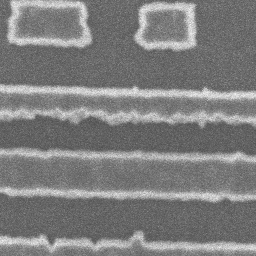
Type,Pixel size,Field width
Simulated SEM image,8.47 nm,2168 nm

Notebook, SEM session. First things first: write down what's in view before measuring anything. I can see one or a few lines or trenches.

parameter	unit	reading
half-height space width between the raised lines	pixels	45.5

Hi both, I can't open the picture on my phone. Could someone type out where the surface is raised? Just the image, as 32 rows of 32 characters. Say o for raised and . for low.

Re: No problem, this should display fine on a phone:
..oooooooo......................
..ooooooooo.......oooooo........
.oooooooooo.......oooooo........
.oooooooooo.......oooooo........
.oooooooooo......ooooooo........
.........oo.......oooooo........
................................
................................
................................
................................
................................
ooooooooooooooooo........o......
oooooooooooooooooooooooooooooooo
oooooooooooooooooooooooooooooooo
.o.o...ooo..oooooooooooooooooooo
................................
................................
................................
................................
oooooooooooooooooooooooooooo.oo.
oooooooooooooooooooooooooooooooo
oooooooooooooooooooooooooooooooo
oooooooooooooooooooooooooooooooo
oooooooooooooooooooooooooooooooo
.............ooo.o.ooooooooooooo
................................
................................
................................
................................
.................o..............
oooooo.ooooooooooo..............
oooooooooooooooooooooooooooooooo